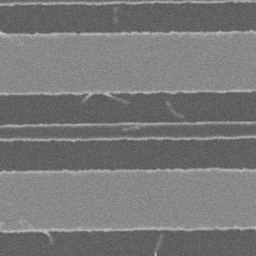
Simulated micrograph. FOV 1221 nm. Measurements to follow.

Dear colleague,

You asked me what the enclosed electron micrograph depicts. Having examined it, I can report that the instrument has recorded lines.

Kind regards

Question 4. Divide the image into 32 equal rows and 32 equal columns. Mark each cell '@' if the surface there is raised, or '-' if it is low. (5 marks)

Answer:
@@@@@@@-@-@@@@------------------
--------------------------------
--------------------------------
--------------------------------
@@@@@@@@@@@@@@@@@@@@@@@@@@@@@@@@
@@@@@@@@@@@@@@@@@@@@@@@@@@@@@@@@
@@@@@@@@@@@@@@@@@@@@@@@@@@@@@@@@
@@@@@@@@@@@@@@@@@@@@@@@@@@@@@@@@
@@@@@@@@@@@@@@@@@@@@@@@@@@@@@@@@
@@@@@@@@@@@@@@@@@@@@@@@@@@@@@@@@
@@@@@@@@@@@@@@@@@@@@@@@@@@@@@@@@
@@@@@@@@@@@@@@@@@@@@@@-@---@----
--------------------------------
--------------------------------
--------------------------------
--------------@@@@@@@@@@@@@@@@@@
@@@@@@@@@@@@@@@@@@@@@@@@@@@@@@@@
@@@@@@@@@@@@-@------------------
--------------------------------
--------------------------------
--------------------------------
-@-@@@@@@@@@@@@@@@@@@@@@@@@@@@@@
@@@@@@@@@@@@@@@@@@@@@@@@@@@@@@@@
@@@@@@@@@@@@@@@@@@@@@@@@@@@@@@@@
@@@@@@@@@@@@@@@@@@@@@@@@@@@@@@@@
@@@@@@@@@@@@@@@@@@@@@@@@@@@@@@@@
@@@@@@@@@@@@@@@@@@@@@@@@@@@@@@@@
@@@@@@@@@@@@@@@@@@@@@@@@@@@@@@@@
@@@@@@@@@@@@@@@@@@@@@@@@@@@@@@@@
--------------------------------
--------------------------------
--------------------------------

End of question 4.